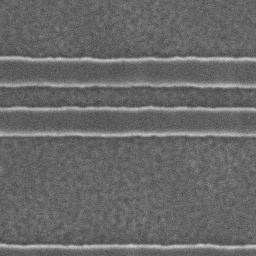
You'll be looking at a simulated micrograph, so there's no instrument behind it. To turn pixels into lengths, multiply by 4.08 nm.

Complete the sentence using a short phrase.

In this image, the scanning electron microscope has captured lines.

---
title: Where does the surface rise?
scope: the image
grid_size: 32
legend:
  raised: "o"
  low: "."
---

................................
................................
................................
................................
................................
................................
................................
oooooooooooooooooooooooooooooooo
oooooooooooooooooooooooooooooooo
oooooooooooooooooooooooooooooooo
oooooooooooooooooooooooooooooooo
................................
................................
.ooo...oooooooo..oooo.ooo.......
oooooooooooooooooooooooooooooooo
oooooooooooooooooooooooooooooooo
oooooooooooooooooooooooooooooooo
................................
................................
................................
................................
................................
................................
................................
................................
................................
................................
................................
................................
................................
................................
oooooooooooooooooooooooooooooooo